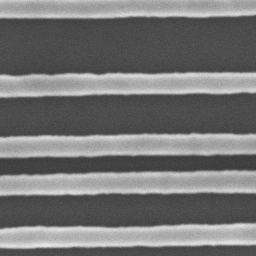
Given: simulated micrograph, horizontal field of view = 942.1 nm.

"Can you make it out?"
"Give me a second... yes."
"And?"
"lines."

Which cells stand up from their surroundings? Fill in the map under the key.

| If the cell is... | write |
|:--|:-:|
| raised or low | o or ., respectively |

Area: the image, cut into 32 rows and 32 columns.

oooooooooooooooooooooooooooooooo
oooooooooooooooooooooooooooooooo
................................
................................
................................
................................
................................
................................
................................
o..ooooooooooooooooooooooooooooo
oooooooooooooooooooooooooooooooo
oooooooooooooooooooooooooooooo..
................................
................................
................................
................................
................................
oooooooooooooooooooooooooooooooo
oooooooooooooooooooooooooooooooo
oooooooooo.o....................
................................
........................oooooooo
oooooooooooooooooooooooooooooooo
oooooooooooooooooooooooooooooooo
................................
................................
................................
................................
..ooooooooooo..ooooooooooooooooo
oooooooooooooooooooooooooooooooo
oooooooooooooooooooooooooooooooo
................................